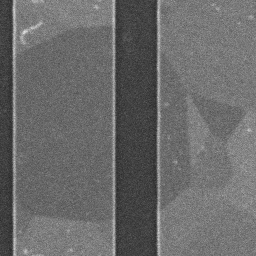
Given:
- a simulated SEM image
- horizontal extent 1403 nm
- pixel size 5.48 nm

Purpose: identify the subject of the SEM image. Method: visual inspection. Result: one or a few lines or trenches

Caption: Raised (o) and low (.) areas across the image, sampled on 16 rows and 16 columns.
.oooooo...oooooo
.oooooo...oooooo
.oooooo...oooooo
.oooooo...oooooo
.oooooo...oooooo
.oooooo...oooooo
.oooooo...oooooo
.oooooo...oooooo
.oooooo...oooooo
.oooooo...oooooo
.oooooo...oooooo
.oooooo...oooooo
.oooooo...oooooo
.oooooo...oooooo
.oooooo...oooooo
.oooooo...oooooo